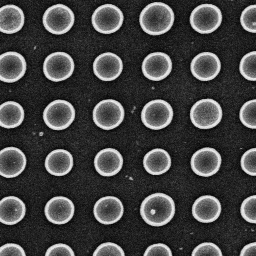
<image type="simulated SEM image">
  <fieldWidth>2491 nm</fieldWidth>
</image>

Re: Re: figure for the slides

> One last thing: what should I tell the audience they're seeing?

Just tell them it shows a regular array of raised bodies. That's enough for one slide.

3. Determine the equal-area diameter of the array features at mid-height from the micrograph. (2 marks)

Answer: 270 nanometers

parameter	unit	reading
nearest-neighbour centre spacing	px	47.5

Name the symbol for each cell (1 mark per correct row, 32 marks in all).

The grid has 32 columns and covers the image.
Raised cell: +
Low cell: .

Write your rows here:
...................+............
+++...+++...+++...+++...+++...++
+++...+++...+++...++++..++++..++
++....+++...+++...+++...+++....+
................................
................................
................................
+++...+++...+++...+++...+++...++
+++...+++...+++...+++...+++...++
+++...++....+++...+++....++....+
................................
................................
................................
+++...+++...+++...+++...+++...++
+++...+++...+++...+++...++++..++
++....+++...+++...+++...+++....+
................................
................................
................................
+++...+++...+++...+++...+++...++
+++...+++...+++...+++...+++...++
+++...++.....+.....+.....++....+
................................
................................
...................++...........
+++...+++...+++...++++..+++...++
+++...+++...+++...++++..+++...++
++....++....+++...+++....++....+
................................
................................
.........................+......
+++...+++...+++...+++...+++...++